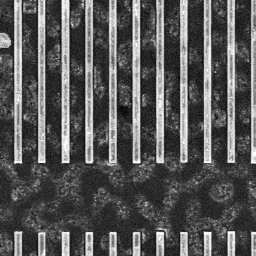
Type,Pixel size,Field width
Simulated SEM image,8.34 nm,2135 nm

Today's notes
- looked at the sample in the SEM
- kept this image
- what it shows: parallel lines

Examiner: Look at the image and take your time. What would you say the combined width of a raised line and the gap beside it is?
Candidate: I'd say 198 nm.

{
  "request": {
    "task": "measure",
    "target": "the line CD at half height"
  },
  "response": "51.1 nm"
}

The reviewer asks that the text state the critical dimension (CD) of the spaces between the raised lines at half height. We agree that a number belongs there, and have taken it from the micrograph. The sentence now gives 18.3 pixels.